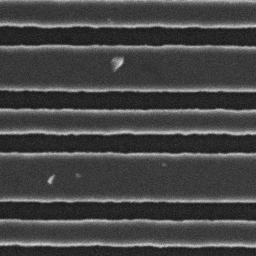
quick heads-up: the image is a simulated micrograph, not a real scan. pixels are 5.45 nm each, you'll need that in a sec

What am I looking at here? lines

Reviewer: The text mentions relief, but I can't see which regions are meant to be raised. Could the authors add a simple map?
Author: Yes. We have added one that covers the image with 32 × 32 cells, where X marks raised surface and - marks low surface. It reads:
XXXXXXXXXXXXXXXXXXXXXXXXXXXXXXXX
XXXXXXXXXXXXXXXXXXXXXXXXXXXXXXXX
XXXXXXXXXXXXXXXXXXXXXXXXXXXXXXXX
--------------------------------
--------------------------------
--------------------------------
XXXXXXXXXXXXXXXXXXXXXXXXXXXXXXXX
XXXXXXXXXXXXXXXXXXXXXXXXXXXXXXXX
XXXXXXXXXXXXXXXXXXXXXXXXXXXXXXXX
XXXXXXXXXXXXXXXXXXXXXXXXXXXXXXXX
XXXXXXXXXXXXXXXXXXXXXXXXXXXXXXXX
--------------------------------
--------------------------------
--------------------------------
XXXXXXXXXXXXXXXXXXXXXXXXXXXXXXXX
XXXXXXXXXXXXXXXXXXXXXXXXXXXXXXXX
XXXXXXXXXXXXXXXXXXXXXXXXXXXXXXXX
--------------------------------
--------------------------------
XXXXXXXXXXXXXXXXXXXXXXXXXXXXXXXX
XXXXXXXXXXXXXXXXXXXXXXXXXXXXXXXX
XXXXXXXXXXXXXXXXXXXXXXXXXXXXXXXX
XXXXXXXXXXXXXXXXXXXXXXXXXXXXXXXX
XXXXXXXXXXXXXXXXXXXXXXXXXXXXXXXX
XXXXXXXXXXXXXXXXXXXXXXXXXXXXXXXX
--------------------------------
--------------------------------
XXX-------XXXX-XXXX-------------
XXXXXXXXXXXXXXXXXXXXXXXXXXXXXXXX
XXXXXXXXXXXXXXXXXXXXXXXXXXXXXXXX
XXXXXXXXXXXXXXXXXXXXXXXXXXXXXXXX
--------------------------------